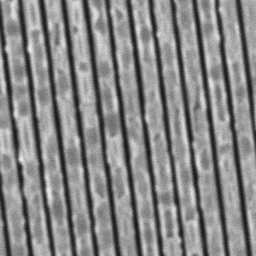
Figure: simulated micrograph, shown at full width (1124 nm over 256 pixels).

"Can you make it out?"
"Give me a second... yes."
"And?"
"parallel lines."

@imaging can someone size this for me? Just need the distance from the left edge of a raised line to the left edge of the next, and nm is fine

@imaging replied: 95.2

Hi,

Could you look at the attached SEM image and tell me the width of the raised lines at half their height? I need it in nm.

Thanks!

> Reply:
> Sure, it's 70.8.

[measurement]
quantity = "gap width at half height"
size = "23.9 nanometres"